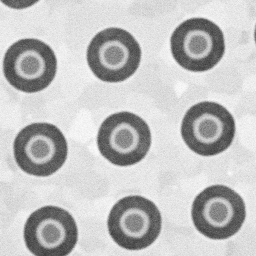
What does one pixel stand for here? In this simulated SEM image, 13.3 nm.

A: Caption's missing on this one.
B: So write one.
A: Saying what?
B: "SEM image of an array of small figures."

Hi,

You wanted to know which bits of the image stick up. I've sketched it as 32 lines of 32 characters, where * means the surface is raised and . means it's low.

.....***************************
********************************
***********************...******
*************..*******......****
************.....****...**..****
*.....*****...*..****..***..****
*......****..***..***...**..****
..***..****..***..****......****
..***..****......******....*****
...*...*****.....***************
*.....**************************
***..***************************
********************************
************************....****
*************....******......***
***....******......****..**...**
**......****..***..***...**...**
**..**..****..***..****..**..***
**..**...***...*...****......***
**..**...****.....*******..*****
**......******...***************
***....*************************
********************************
**************************...***
****************..******......**
**************......****..**...*
****.....*****..*...****..***..*
***......****..***..****..**...*
***..***..***..***..****......**
***..***..****......*****....***
***...*...****.....*************
****.....***********************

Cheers